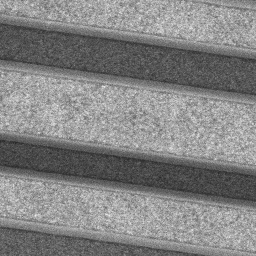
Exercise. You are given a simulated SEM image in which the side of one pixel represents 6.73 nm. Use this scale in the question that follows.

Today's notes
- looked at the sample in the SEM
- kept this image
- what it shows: one or a few lines or trenches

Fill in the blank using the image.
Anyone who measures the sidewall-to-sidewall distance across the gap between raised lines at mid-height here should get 273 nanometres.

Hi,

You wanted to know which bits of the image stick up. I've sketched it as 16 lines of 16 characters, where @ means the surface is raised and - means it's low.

@@@@@@@@@@@@@@@@
--@@@@@@@@@@@@@@
----------@@@@@@
----------------
@@@-------------
@@@@@@@@@@------
@@@@@@@@@@@@@@@@
@@@@@@@@@@@@@@@@
-@@@@@@@@@@@@@@@
--------@@@@@@@@
---------------@
@@@@@@----------
@@@@@@@@@@@@@---
@@@@@@@@@@@@@@@@
-----@@@@@@@@@@@
------------@@@@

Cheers